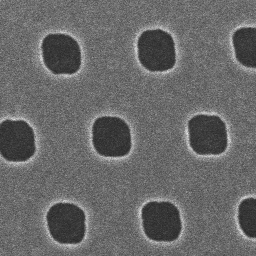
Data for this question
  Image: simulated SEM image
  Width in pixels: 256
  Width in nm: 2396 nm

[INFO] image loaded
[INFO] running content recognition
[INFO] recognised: holes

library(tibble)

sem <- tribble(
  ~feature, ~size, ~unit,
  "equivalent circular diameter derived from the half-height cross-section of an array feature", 394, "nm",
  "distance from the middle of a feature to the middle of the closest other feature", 892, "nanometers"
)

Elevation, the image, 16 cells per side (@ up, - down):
@@@@@@@@@@@@@@@@
@@@@@@@@@@@@@@@@
@@@--@@@@--@@@@-
@@@--@@@@--@@@@-
@@@--@@@@@@@@@@@
@@@@@@@@@@@@@@@@
@@@@@@@@@@@@@@@@
@@@@@@--@@@@--@@
--@@@@--@@@@--@@
--@@@@--@@@@--@@
@@@@@@@@@@@@@@@@
@@@@@@@@@@@@@@@@
@@@@@@@@@@@@@@@-
@@@--@@@@--@@@@-
@@@--@@@@--@@@@-
@@@@@@@@@@@@@@@@